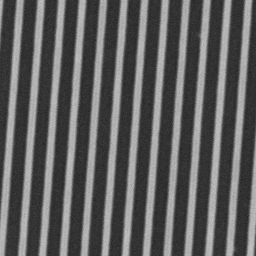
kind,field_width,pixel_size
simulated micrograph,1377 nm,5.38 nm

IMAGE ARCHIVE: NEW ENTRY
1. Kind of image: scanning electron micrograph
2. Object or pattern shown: parallel lines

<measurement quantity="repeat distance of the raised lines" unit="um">0.111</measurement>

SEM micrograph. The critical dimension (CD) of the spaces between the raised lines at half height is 78.4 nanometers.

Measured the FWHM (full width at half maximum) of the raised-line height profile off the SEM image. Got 34.2 nanometers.